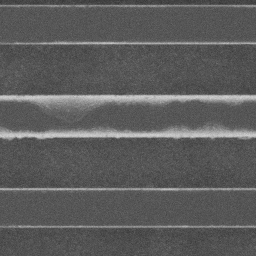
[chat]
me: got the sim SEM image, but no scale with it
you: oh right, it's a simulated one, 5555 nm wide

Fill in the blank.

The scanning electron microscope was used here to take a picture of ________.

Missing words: lines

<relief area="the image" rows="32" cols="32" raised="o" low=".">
................................
oooooooooooooooooooooooooooooooo
oooooooooooooooooooooooooooooooo
oooooooooooooooooooooooooooooooo
oooooooooooooooooooooooooooooooo
................................
................................
................................
................................
................................
................................
................................
oooooooo.ooooooooooooooooooooooo
oooooooooooooooooooooooooooooooo
oooooooooooooooooooooooooooooooo
oooooooooooooooooooooooooooooooo
oooooooooooooooooooooooooooooooo
................................
................................
................................
................................
................................
................................
................................
oooooooooooooooooooooooooooooooo
oooooooooooooooooooooooooooooooo
oooooooooooooooooooooooooooooooo
oooooooooooooooooooooooooooooooo
................................
................................
................................
................................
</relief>